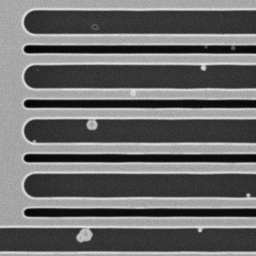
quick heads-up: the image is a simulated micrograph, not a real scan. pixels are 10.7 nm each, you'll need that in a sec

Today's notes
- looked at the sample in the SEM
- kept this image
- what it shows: groups of lines, slits or small figures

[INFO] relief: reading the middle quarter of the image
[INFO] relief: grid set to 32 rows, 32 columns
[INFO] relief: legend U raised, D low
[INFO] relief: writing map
DDDDDDDDDDDDDDDDDDDDDDDDDDDDDDDD
DDDDDDDDDDDDDDDDDDDDDDDDDDDDDDDD
DDDDDDDDDDDDDDDDDDDDDDDDDDDDDDDD
DDDDDDDDDDDDDDDDDDDDDDDDDDDDDDDD
DDDDDDDDDDDDDDDDDDDDDDDDDDDDDDDD
DDDDDDDDDDDDDDDDDDDDDDDDDDDDDDDD
UUUUUUUUUUUUUUUUUUUUUUUUUUUUUUUU
UUUUUUUUUUUUUUUUUUUUUUUUUUUUUUUU
UUUUUUUUUUUUUUUUUUUUUUUUUUUUUUUU
DDDDDDDDDDDDDDDDDDDDDDDDDDDDDDDD
DDDDDDDDDDDDDDDDDDDDDDDDDDDDDDDD
UUUUUUUUUUUUUUUUUUUUUUUUUUUUUUUU
UUUUUUUUUUUUUUUUUUUUUUUUUUUUUUUU
UUUUUUUUUUUUUUUUUUUUUUUUUUUUUUUU
DDDDDDDDDDDDDDDDDDDDDDDDDDDDDDDD
DDDDDDDDDDDDDDDDDDDDDDDDDDDDDDDD
DDDDDDDDDDDDDDDDDDDDDDDDDDDDDDDD
DDDDDDDDDDDDDDDDDDDDDDDDDDDDDDDD
DDDDDDDDDDDDDDDDDDDDDDDDDDDDDDDD
DDDDDDDDDDDDDDDDDDDDDDDDDDDDDDDD
UUUUUUUUUUUUUUUUUUUUUUUUUUUUUUUU
UUUUUUUUUUUUUUUUUUUUUUUUUUUUUUUU
DDUUUUUUUUDDDDUUUUUUUUUUUUUUUUUU
DDDDDDDDDDDDDDDDDDDDDDDDDDDDDDDD
DDDDDDDDDDDDDDDDDDDDDDDDDDDDDDDD
UUUUUUUUUUUUUUUUUUUUUUUUUUUUUUUU
UUUUUUUUUUUUUUUUUUUUUUUUUUUUUUUU
DDDDDDDDDDDDDDDDDDDDDDDDDDDDDDDD
DDDDDDDDDDDDDDDDDDDDDDDDDDDDDDDD
DDDDDDDDDDDDDDDDDDDDDDDDDDDDDDDD
DDDDDDDDDDDDDDDDDDDDDDDDDDDDDDDD
DDDDDDDDDDDDDDDDDDDDDDDDDDDDDDDD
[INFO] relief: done